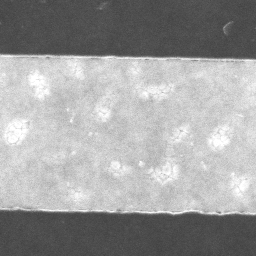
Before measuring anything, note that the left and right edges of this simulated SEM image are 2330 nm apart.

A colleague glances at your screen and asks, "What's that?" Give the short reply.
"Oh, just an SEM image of one or a few lines or trenches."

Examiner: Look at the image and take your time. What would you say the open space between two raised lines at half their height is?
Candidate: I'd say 1390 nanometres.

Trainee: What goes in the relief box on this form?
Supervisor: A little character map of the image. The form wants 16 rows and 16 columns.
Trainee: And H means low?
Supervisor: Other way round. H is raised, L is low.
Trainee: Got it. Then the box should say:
HHHHHHHHHHHHHHHH
HHHHHHHHHHHHHHHH
HHHHHHHHHHHHHHHH
HHHHHHHHHHHHHHHH
LLLLLLLLLLLLLLLL
LLLLLLLLLLLLLLLL
LLLLLLLLLLLLLLLL
LLLLLLLLLLLLLLLL
LLLLLLLLLLLLLLLL
LLLLLLLLLLLLLLLL
LLLLLLLLLLLLLLLL
LLLLLLLLLLLLLLLL
LLLLLLLLLLLLLLLL
HHHHHHHHHHHHHHHH
HHHHHHHHHHHHHHHH
HHHHHHHHHHHHHHHH